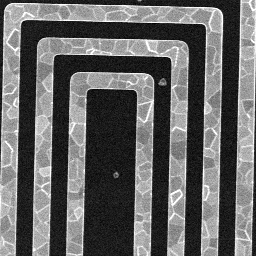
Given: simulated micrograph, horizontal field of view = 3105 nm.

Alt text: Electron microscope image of groups of lines, slits or small figures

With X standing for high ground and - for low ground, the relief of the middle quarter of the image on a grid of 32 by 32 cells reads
---------------------------XXXX-
---------------------------XXXX-
---XXXXXXXXXXXXXXXXXX------XXXX-
--XXXXXXXXXXXXXXXXXXXX-----XXXX-
--XXXXXXXXXXXXXXXXXXXX--X--XXXX-
--XXXXXXXXXXXXXXXXXXXX-----XXXX-
--XXXX-----------XXXXX-----XXXX-
--XXXX------------XXXX-----XXXX-
--XXX-------------XXXX-----XXXX-
--XXX-------------XXXX-----XXXX-
--XXX-------------XXXX-----XXXX-
--XXX-------------XXXX-----XXXX-
--XXX-------------XXXX-----XXXX-
--XXX-------------XXXX-----XXXX-
-XXXX-------------XXXX-----XXXX-
-XXXX-------------XXXX-----XXXX-
-XXXX-------------XXXX-----XXXX-
-XXXX-------------XXXX-----XXXX-
-XXXX-------------XXXX-----XXXX-
-XXXX-------------XXXX-----XXX--
-XXXX-------------XXXX-----XXX--
-XXXX-------------XXXX-----XXX--
-XXXX-------------XXXX-----XXX--
-XXXX-------------XXXX-----XXX--
-XXXX-------------XXXX-----XXX--
-XXXX-------------XXXX-----XXX--
-XXXX-------------XXXX-----XXX--
-XXXX-------------XXXX-----XXX--
-XXXX-------------XXXX----XXXX--
-XXXX-------------XXXX----XXXX--
-XXXX-------------XXXX----XXXX--
-XXXX-------------XXXX----XXXX--